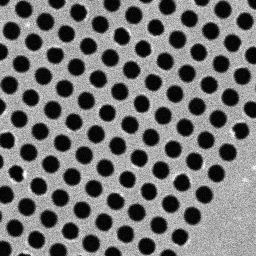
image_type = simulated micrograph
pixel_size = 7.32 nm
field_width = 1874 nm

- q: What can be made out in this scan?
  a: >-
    a regular array of holes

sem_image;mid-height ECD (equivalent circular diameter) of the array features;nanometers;128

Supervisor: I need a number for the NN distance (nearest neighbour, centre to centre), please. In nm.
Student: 177